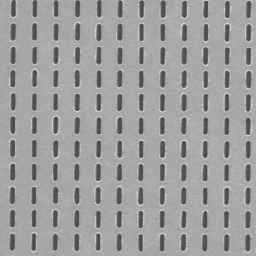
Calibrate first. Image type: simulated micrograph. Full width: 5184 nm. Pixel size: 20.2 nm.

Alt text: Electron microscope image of a regular array of holes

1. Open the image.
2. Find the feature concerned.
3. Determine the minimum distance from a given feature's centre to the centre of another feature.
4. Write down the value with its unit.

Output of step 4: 430 nanometers